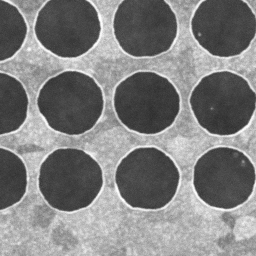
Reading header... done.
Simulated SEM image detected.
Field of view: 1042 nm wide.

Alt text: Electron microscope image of holes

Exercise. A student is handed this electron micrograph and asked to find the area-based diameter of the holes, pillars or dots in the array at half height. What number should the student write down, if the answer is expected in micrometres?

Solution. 0.265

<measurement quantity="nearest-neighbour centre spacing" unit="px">75.8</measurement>